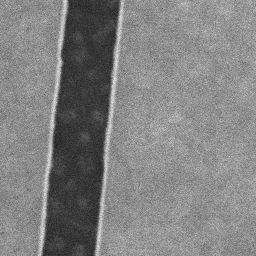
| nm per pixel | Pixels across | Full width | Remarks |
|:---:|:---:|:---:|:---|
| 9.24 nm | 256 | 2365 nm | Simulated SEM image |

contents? one or a few lines or trenches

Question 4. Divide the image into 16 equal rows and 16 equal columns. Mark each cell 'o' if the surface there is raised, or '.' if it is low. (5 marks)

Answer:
oooo....oooooooo
oooo....oooooooo
oooo...ooooooooo
oooo...ooooooooo
oooo...ooooooooo
oooo...ooooooooo
ooo....ooooooooo
ooo....ooooooooo
ooo....ooooooooo
ooo....ooooooooo
ooo....ooooooooo
ooo...oooooooooo
ooo...oooooooooo
ooo...oooooooooo
ooo...oooooooooo
ooo...oooooooooo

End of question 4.